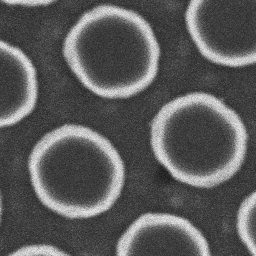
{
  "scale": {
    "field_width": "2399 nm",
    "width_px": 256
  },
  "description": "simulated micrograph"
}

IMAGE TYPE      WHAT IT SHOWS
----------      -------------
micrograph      raised bodies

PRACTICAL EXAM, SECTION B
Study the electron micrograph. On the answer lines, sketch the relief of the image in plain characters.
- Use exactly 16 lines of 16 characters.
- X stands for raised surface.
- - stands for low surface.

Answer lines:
------------XXXX
-----XXXX---XXXX
----XXXXXX--XXXX
X---XXXXXX---XXX
XX---XXXXX------
XX----XXX-------
XX---------XXX--
X---------XXXXX-
---XXX----XXXXX-
--XXXXX---XXXXX-
--XXXXX----XXXX-
--XXXXX---------
---XXXX---------
---------------X
--------XXXX---X
--------XXXXX---